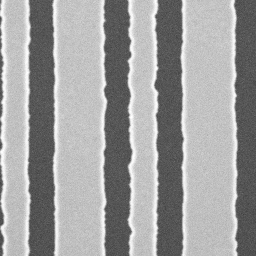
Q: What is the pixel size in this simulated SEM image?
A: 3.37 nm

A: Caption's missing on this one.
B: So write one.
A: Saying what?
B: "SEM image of lines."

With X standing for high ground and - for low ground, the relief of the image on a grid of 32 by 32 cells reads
XXXX---XXXXXX---XXXX---XXXXXX---
XXXX---XXXXXX---XXXX---XXXXXX---
XXXX---XXXXXX---XXX----XXXXXX---
XXXX---XXXXXX---XXX----XXXXXX---
XXXX---XXXXXX---XXX----XXXXXX---
XXXX---XXXXXX---XXXX---XXXXXX---
XXXX---XXXXXX---XXXX---XXXXXX---
XXXX---XXXXXX---XXXX---XXXXXX---
XXXX---XXXXXX---XXXX---XXXXXX---
XXXX---XXXXXX---XXX----XXXXXX---
XXXX---XXXXXX---XXX----XXXXXX---
XXXX---XXXXXX---XXXX---XXXXXX---
XXXX---XXXXXX---XXXX---XXXXXX---
XXXX---XXXXXX---XXXX---XXXXXX---
XXXX---XXXXXX---XXX----XXXXXX---
XXXX---XXXXXX---XXXX---XXXXXX---
XXXX---XXXXXX---XXXX---XXXXXX---
XXXX---XXXXXX---XXX----XXXXXXX--
XXXX---XXXXXX---XXXX---XXXXXXX--
XXXX---XXXXXX----XXX---XXXXXX---
XXXX---XXXXXX---XXXX---XXXXXX---
XXX----XXXXXX---XXXX---XXXXXXX--
XXXX---XXXXXX---XXXX---XXXXXX---
XXXX---XXXXXX---XXXX---XXXXXX---
XXXX---XXXXXX---XXXX---XXXXXXX--
XXXX---XXXXXX---XXXX---XXXXXX---
XXXX---XXXXXX---XXXX---XXXXXX---
-XXX---XXXXXX---XXXX---XXXXXXX--
XXXX---XXXXXX---XXXX---XXXXXXX--
XXXX---XXXXXX---XXXX---XXXXXX---
XXXX---XXXXXX---XXX----XXXXXXX--
XXXX---XXXXXX---XXX----XXXXXXX--